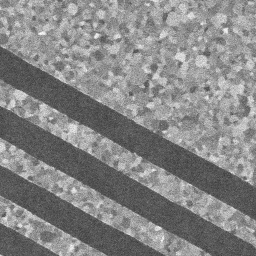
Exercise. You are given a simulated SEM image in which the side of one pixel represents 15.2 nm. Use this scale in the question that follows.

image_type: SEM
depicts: parallel lines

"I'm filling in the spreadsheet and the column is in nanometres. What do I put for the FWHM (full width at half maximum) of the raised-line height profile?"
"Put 342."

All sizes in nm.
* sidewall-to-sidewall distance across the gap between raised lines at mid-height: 439